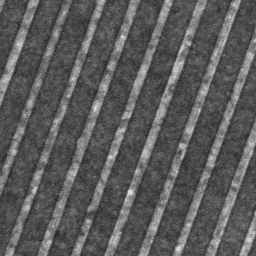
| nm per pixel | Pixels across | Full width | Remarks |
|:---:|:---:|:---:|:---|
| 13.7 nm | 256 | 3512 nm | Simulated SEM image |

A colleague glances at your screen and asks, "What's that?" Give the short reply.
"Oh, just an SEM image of parallel lines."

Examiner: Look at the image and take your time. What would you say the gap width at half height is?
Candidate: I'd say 335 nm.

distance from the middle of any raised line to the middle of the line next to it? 0.433 micrometres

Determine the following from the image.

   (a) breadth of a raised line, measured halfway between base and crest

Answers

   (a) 93.4 nm